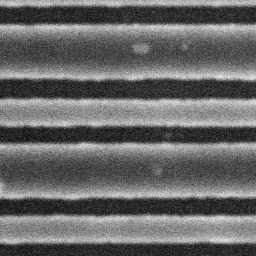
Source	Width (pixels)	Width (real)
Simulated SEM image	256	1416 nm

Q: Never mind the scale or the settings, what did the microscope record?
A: lines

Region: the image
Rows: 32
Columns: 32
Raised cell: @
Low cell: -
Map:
@@@@@@@@@@@@@@@@@@@@@@@@@@@@@@@@
--------------------------------
--------------------------------
@@@@@@@@@@@@@@@@@@@@@@@@@@@@@@@@
@@@@@@@@@@@@@@@@@@@@@@@@@@@@@@@@
@@@@@@@@@@@@@@@@@@@@@@@@@@@@@@@@
@@@@@@@@@@@@@@@@@@@@@@@@@@@@@@@@
@@@@@@@@@@@@@@@@@@@@@@@@@@@@@@@@
@@@@@@@@@@@@@@@@@@@@@@@@@@@@@@@@
@@@@@@@@@@@@@@@@@@@@@@@@@@@@@@@@
--------------------------------
--------------------------------
@@-@@@-@------------------@-@---
@@@@@@@@@@@@@@@@@@@@@@@@@@@@@@@@
@@@@@@@@@@@@@@@@@@@@@@@@@@@@@@@@
@@@@@@@@@@@@@@@@@@@@@@@@@@@@@@@@
--------------------------------
--------------------------------
@@@@@@@@@@@@@@@@@@@@@@@@@@@@@@@@
@@@@@@@@@@@@@@@@@@@@@@@@@@@@@@@@
@@@@@@@@@@@@@@@@@@@@@@@@@@@@@@@@
@@@@@@@@@@@@@@@@@@@@@@@@@@@@@@@@
@@@@@@@@@@@@@@@@@@@@@@@@@@@@@@@@
@@@@@@@@@@@@@@@@@@@@@@@@@@@@@@@@
@@@@@@@@@@@@@@@@@@@@@@@@@@@@@@@@
--------------------------------
--------------------------------
@@@@@@@@@@@@@@@@@@@@@@@@@@@@@@@@
@@@@@@@@@@@@@@@@@@@@@@@@@@@@@@@@
@@@@@@@@@@@@@@@@@@@@@@@@@@@@@@@@
--------------------------------
--------------------------------